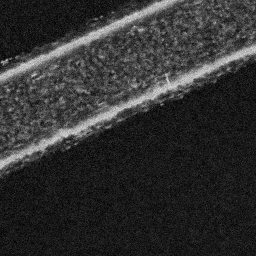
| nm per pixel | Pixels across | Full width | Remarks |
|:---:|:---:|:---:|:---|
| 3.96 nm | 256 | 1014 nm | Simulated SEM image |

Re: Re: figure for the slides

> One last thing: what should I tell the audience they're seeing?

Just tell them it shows one or a few lines or trenches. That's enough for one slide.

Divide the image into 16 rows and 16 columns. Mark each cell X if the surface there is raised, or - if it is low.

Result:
----------XXXXXX
-------XXXXXXXXX
-----XXXXXXXXXXX
---XXXXXXXXXXXX-
-XXXXXXXXXXXX---
XXXXXXXXXX------
XXXXXXXX--------
XXXXXX----------
XXXX------------
XX--------------
----------------
----------------
----------------
----------------
----------------
----------------